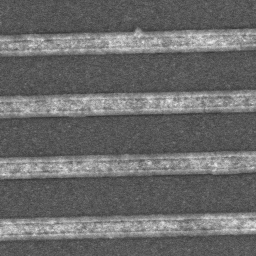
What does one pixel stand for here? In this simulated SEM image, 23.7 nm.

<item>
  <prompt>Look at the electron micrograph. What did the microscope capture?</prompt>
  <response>parallel lines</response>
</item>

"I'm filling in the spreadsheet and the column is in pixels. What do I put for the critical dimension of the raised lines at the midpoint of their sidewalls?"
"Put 16.5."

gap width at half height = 1060 nanometers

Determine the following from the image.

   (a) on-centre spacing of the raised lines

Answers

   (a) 1.45 µm